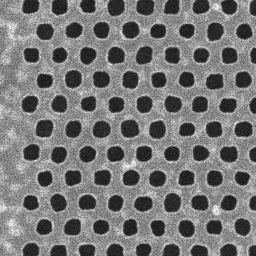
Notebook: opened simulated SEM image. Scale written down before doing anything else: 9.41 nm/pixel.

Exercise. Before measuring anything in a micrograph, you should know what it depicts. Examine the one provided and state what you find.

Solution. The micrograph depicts a regular array of holes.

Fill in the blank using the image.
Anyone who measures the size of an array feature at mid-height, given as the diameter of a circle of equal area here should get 160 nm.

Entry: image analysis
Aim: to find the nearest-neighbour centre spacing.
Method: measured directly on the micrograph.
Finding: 259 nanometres